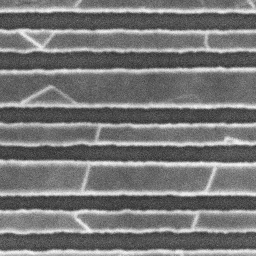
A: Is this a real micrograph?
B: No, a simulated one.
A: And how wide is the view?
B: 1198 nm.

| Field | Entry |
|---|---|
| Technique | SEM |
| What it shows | lines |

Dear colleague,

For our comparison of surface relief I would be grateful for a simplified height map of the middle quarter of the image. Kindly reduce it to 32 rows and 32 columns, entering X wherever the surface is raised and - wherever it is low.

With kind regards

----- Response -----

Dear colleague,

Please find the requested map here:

--------------------------------
-------------XX------XXXXXXXXXXX
XXXXXXXXXXXXXXXXXXXXXXXXXXXXXXXX
XXXXXXXXXXXXXXXXXXXXXXXXXXXXXXXX
XXXXXXXXXXXXXXXXXXXXXXXXXXXXXXXX
XXXXXXXXXXXXXXXXXXXXXXXXXXXXXXXX
XXXXXXXXXXXXXXXXXXXXXXXXXXXXXXXX
XXXXXXXXXXXXXXXXXXXXXXXXXXXXXXXX
XXXXXXXXXXXXXXXXXXXXXXXXXXXXXXXX
XXXXXXXXXXXXXXXXXXXXXXXXXXXXXXXX
XXXXXXXXXXXXXXXXXXXXXXXXXXXXXXXX
--------------------------------
--------------------------------
--------------------------------
--------------------------------
XXXXXXXXXXXXXXXXXXXXXXXXXXXXXXXX
XXXXXXXXXXXXXXXXXXXXXXXXXXXXXXXX
XXXXXXXXXXXXXXXXXXXXXXXXXXXXXXXX
XXXXXXXXXXXXXXXXXXXXXXXXXXXXXXXX
XXXXXXXXXXXXXXXXXXXXXXXXXXXXXXXX
--------------------------------
--------------------------------
--------------------------------
--------------------------------
XXX-----------------------------
XXXXXXXXXXXXXXXXXXXXXXXXXXXXXXXX
XXXXXXXXXXXXXXXXXXXXXXXXXXXXXXXX
XXXXXXXXXXXXXXXXXXXXXXXXXXXXXXXX
XXXXXXXXXXXXXXXXXXXXXXXXXXXXXXXX
XXXXXXXXXXXXXXXXXXXXXXXXXXXXXXXX
XXXXXXXXXXXXXXXXXXXXXXXXXXXXXXXX
XXXXXXXXXXXXXXXXXXXXXXXXXXXXXXXX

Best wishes